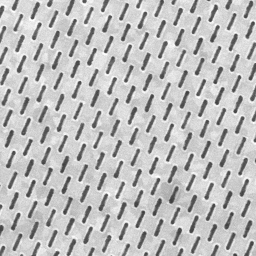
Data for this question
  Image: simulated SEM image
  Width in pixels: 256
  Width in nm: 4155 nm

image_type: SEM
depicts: a regular array of holes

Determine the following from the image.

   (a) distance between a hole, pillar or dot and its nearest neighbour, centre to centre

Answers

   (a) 327 nm